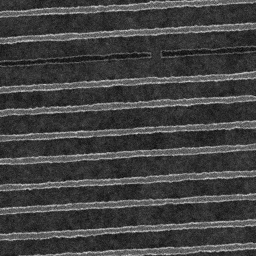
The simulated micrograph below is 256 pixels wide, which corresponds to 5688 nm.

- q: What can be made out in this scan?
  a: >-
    parallel lines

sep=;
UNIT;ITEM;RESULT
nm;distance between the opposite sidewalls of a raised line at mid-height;130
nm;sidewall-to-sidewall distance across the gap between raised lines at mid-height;422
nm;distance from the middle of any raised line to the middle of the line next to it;547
